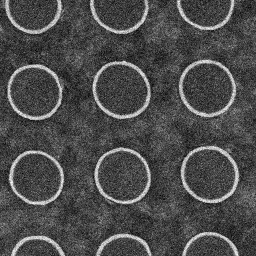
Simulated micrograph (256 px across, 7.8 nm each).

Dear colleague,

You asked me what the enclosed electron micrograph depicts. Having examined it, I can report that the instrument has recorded raised bodies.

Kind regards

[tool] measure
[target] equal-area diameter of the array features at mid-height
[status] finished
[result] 0.423 micrometres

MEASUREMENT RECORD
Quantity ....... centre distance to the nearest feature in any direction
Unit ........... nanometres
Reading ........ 670